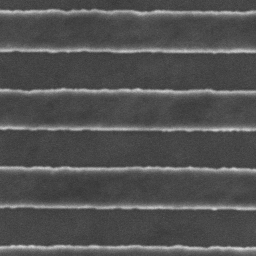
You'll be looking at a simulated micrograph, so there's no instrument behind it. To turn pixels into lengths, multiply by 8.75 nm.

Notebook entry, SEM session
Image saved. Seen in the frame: lines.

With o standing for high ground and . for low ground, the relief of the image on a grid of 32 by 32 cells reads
................................
ooooooooooooooooo.ooooooooooo.oo
oooooooooooooooooooooooooooooooo
oooooooooooooooooooooooooooooooo
oooooooooooooooooooooooooooooooo
oooooooooooooooooooooooooooooooo
......ooo.....ooo...oooooooooooo
................................
................................
................................
................................
oooooooooooooooooooooooooooooooo
oooooooooooooooooooooooooooooooo
oooooooooooooooooooooooooooooooo
oooooooooooooooooooooooooooooooo
oooooooooooooooooooooooooooooooo
................................
................................
................................
................................
................................
oooooooooooooooooooooooooooooooo
oooooooooooooooooooooooooooooooo
oooooooooooooooooooooooooooooooo
oooooooooooooooooooooooooooooooo
oooooooooooooooooooooooooooooooo
................................
................................
................................
................................
................................
oooooooooooooooooooooooooooooooo